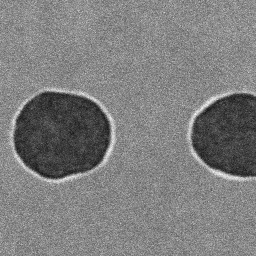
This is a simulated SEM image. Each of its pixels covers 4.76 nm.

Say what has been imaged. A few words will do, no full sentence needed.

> holes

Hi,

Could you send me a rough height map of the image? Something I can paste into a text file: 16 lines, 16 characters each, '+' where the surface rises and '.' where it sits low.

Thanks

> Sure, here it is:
++++++++++++++++
++++++++++++++++
++++++++++++++++
++++++++++++++++
++++++++++++++++
++++++++++++++++
++....+++++++...
+......+++++....
+......+++++....
+......+++++....
++....+++++++...
++++++++++++++++
++++++++++++++++
++++++++++++++++
++++++++++++++++
++++++++++++++++